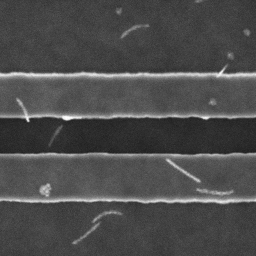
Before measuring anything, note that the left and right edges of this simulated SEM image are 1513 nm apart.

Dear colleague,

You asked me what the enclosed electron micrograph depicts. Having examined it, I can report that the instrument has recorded lines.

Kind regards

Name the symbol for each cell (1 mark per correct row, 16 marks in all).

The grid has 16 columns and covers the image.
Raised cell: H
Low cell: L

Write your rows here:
LLLLLLLLLLLLLLLL
LLLLLLLLLLLLLLLL
LLLLLLLLLLLLLLLL
LLLLLLLLLLLLLLLL
LLLLLLLLLLLLLLLL
HHHHHHHHHHHHHHHH
HHHHHHHHHHHHHHHH
LLLLLLLLLLLLLLLL
LLLLLLLLLLLLLLLL
LLLLLLLLLLLLLLLL
HHHHHHHHHHHHHHHH
HHHHHHHHHHHHHHHH
LHHHLHLHHHHHHHHH
LLLLLLLLLLLLLLLL
LLLLLLLLLLLLLLLL
LLLLLLLLLLLLLLLL